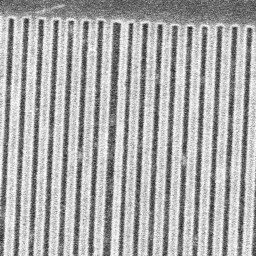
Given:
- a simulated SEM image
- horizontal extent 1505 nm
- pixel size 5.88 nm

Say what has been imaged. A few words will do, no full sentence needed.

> parallel lines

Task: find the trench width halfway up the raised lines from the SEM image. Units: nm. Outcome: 41.1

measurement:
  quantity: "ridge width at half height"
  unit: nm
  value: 46.2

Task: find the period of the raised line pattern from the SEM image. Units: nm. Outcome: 87.5